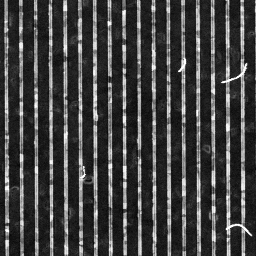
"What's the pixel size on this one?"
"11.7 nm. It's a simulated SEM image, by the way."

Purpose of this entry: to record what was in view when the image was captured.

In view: parallel lines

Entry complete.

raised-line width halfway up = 26.3 nm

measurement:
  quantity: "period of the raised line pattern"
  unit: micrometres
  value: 0.172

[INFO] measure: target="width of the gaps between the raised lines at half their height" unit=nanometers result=147